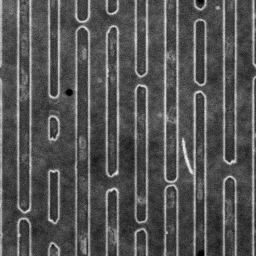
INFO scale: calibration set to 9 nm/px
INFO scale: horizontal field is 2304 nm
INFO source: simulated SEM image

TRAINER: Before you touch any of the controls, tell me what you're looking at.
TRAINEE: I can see parallel lines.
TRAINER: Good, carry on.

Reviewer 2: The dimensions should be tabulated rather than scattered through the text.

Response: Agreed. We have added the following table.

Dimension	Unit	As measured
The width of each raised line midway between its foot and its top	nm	169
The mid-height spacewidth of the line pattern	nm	95.7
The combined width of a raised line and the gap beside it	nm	264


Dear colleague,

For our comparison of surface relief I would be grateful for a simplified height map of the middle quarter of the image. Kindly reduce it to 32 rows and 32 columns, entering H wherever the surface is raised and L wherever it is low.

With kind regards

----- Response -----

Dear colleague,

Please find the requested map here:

HHHLLLHHHHHLLHHHHHLLLHHHHLLLHHHH
HHHLLLHHHHHLLHHHHHLLLHHHHLLLHHHH
HHHLLLHHHHHLLHHHHHLLHHHHHLLLHHHH
HHHLLLHHHHHLLHHHHHHHHHHHHLLLHHHH
HHHLLLHHHHHLLHHHHHHHHHHHHLLLHHHH
HHHLLLHHHHHLLHHHHHHLHHHHHLLLHHHH
HHHLLLHHHHHLLHHHHHLLLHHHHLLLHHHH
HHHLLLHHHHHLLHHHHHLLLHHHHLLLHHHH
HHHLLLHHHHHLLHHHHHLLLHHHHLLLHHHH
HHHLLLHHHHHLLHHHHHLLLHHHHLLLHHHH
HHHLLLHHHHHLLHHHHHLLLHHHHLLLHHHH
HHHLLLHHHHHLLHHHHHLLLHHHHLLLHHHH
HHHLLLHHHHHLLHHHHHLLLHHHHLLLHHHH
HHHLLLHHHHHLLHHHHHLLLHHHHLLLHHHH
HHHLLLHHHHHLLHHHHHLLLHHHHLLLHHHH
HHHLLLHHHHHLLHHHHHLLLHHHHLLLHHHH
HHHLLLHHHHHLLHHHHHLLLHHHHLLLHHHH
HHHLLLHHHHHLLHHHHHLLLHHHHLLLHHHH
HHHLLLHHHHHLLHHHHHLLLHHHHLLLHHHH
HHHLLLHHHHHLLHHHHHLLLHHHHLLLHHHH
HHHLLLHHHHHLLHHHHHLLLHHHHLLLHHHH
HHHLLLHHHHHLLHHHHHLLLHHHHLLLHHHH
HHHLLLHHHHHLLHHHHHLLLHHHHLLLHHHH
HHHLLLHHHHHLLHHHHHLLLHHHHLLLHHHH
HHHLLLHHHHHLLHHHHHLLLHHHHLLLHHHH
HHHLLLHHHHHLLHHHHHLLLHHHHLLLHHHH
HHHLLLHHHHHLLHHHHHLLLHHHHLLLHHHH
HHHLLLHHHHHLHHHHHHLLLHHHHLLLHHHH
HHHLLLHHHHHHHHHHHHLLLHHHHHLLHHHH
HHHLLLHHHHHHHHHHHHLLLHHHHHHHHHHH
HHHLLLHHHHHHHHHHHHLLLHHHHHHHHHHH
HHHLLLHHHHHHLHHHHHLLLHHHHLLLHHHH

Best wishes